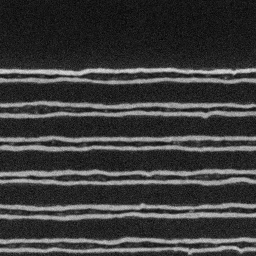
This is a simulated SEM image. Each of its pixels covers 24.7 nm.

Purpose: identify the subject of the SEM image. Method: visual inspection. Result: parallel lines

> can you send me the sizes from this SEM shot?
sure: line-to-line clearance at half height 598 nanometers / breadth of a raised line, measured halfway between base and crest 244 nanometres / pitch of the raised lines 835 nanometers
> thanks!